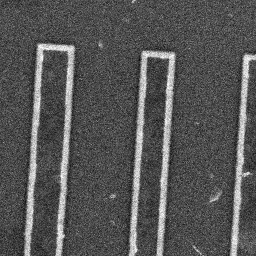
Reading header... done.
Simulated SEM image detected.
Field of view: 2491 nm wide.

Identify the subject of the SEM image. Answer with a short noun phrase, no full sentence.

one or a few lines or trenches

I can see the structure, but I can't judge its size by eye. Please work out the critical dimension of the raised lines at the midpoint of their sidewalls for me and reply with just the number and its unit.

0.297 µm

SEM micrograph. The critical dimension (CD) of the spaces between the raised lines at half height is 719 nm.